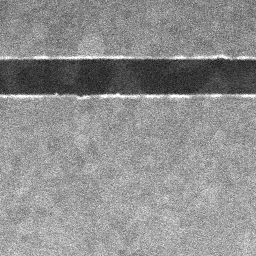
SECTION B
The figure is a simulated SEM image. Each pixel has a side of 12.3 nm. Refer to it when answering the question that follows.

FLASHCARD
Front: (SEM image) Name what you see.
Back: one or a few lines or trenches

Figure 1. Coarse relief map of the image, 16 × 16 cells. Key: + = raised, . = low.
++++++++++++++++
++++++++++++++++
++++++++++++++++
++++++++++++++++
................
................
++++++++++++++++
++++++++++++++++
++++++++++++++++
++++++++++++++++
++++++++++++++++
++++++++++++++++
++++++++++++++++
++++++++++++++++
++++++++++++++++
++++++++++++++++